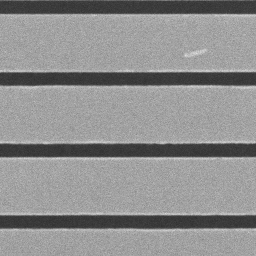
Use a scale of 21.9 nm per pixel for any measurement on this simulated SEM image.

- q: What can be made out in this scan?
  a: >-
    lines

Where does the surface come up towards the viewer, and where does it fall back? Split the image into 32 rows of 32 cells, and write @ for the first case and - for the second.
--------------------------------
--------------------------------
@@@@@@@@@@@@@@@@@@@@@@@@@@@@@@@@
@@@@@@@@@@@@@@@@@@@@@@@@@@@@@@@@
@@@@@@@@@@@@@@@@@@@@@@@@@@@@@@@@
@@@@@@@@@@@@@@@@@@@@@@@@@@@@@@@@
@@@@@@@@@@@@@@@@@@@@@@@@@@@@@@@@
@@@@@@@@@@@@@@@@@@@@@@@@@@@@@@@@
@@@@@@@@@@@@@@@@@@@@@@@@@@@@@@@@
--------------------------------
--------------------------------
@@@@@@@@@@@@@@@@@@@@@@@@@@@@@@@@
@@@@@@@@@@@@@@@@@@@@@@@@@@@@@@@@
@@@@@@@@@@@@@@@@@@@@@@@@@@@@@@@@
@@@@@@@@@@@@@@@@@@@@@@@@@@@@@@@@
@@@@@@@@@@@@@@@@@@@@@@@@@@@@@@@@
@@@@@@@@@@@@@@@@@@@@@@@@@@@@@@@@
@@@@@@@@@@@@@@@@@@@@@@@@@@@@@@@@
--------------------------------
--------------------------------
@@@@@@@@@@@@@@@@@@@@@@@@@@@@@@@@
@@@@@@@@@@@@@@@@@@@@@@@@@@@@@@@@
@@@@@@@@@@@@@@@@@@@@@@@@@@@@@@@@
@@@@@@@@@@@@@@@@@@@@@@@@@@@@@@@@
@@@@@@@@@@@@@@@@@@@@@@@@@@@@@@@@
@@@@@@@@@@@@@@@@@@@@@@@@@@@@@@@@
@@@@@@@@@@@@@@@@@@@@@@@@@@@@@@@@
--------------------------------
--------------------------------
@@@@@@@@@@@@@@@@@@@@@@@@@@@@@@@@
@@@@@@@@@@@@@@@@@@@@@@@@@@@@@@@@
@@@@@@@@@@@@@@@@@@@@@@@@@@@@@@@@